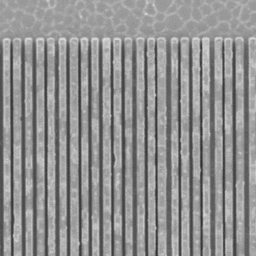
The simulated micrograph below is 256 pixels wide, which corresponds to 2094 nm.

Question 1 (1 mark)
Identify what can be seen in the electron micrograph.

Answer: parallel lines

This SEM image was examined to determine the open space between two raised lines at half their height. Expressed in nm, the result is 28.6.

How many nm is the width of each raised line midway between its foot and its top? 57.2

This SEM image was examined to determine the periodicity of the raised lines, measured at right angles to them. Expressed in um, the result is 0.0906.